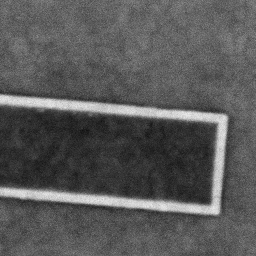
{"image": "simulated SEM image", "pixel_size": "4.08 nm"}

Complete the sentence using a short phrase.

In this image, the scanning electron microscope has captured one or a few lines or trenches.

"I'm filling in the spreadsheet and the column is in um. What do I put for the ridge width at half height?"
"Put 0.375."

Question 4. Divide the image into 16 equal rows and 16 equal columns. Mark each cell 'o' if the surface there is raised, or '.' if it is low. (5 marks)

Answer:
................
................
................
................
................
................
ooo.............
oooooooooooooo..
oooooooooooooo..
oooooooooooooo..
oooooooooooooo..
oooooooooooooo..
......ooooooo...
................
................
................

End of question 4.